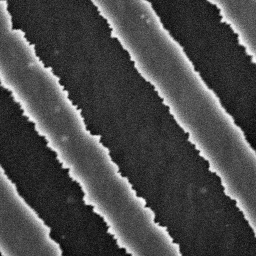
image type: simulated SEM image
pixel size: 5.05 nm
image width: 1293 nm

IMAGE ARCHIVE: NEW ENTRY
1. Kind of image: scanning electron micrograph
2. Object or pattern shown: lines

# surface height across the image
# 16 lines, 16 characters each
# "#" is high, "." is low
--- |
......###.....##
#......###....##
##.....####....#
##......####....
###......###....
.###......###...
.####.....####..
..###......###..
...###......###.
...####......###
....###......###
#....###......##
#....####......#
##....####.....#
###....###......
####....###.....